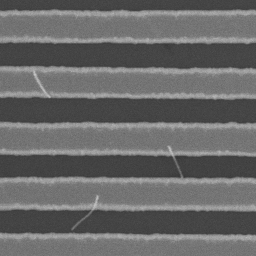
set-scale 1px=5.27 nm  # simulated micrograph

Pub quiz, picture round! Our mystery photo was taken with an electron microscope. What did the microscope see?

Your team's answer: lines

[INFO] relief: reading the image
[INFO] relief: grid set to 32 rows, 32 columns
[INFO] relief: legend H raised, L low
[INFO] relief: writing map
LLLLLLLLLLLLLLLLLLLLLLLLLLLLLLLL
HHHHHHHHHHHHHHHHHHHHHHHHHHHHHHHH
HHHHHHHHHHHHHHHHHHHHHHHHHHHHHHHH
HHHHHHHHHHHHHHHHHHHHHHHHHHHHHHHH
HHHHHHHHHHHHHHHHHHHHHHHHHHHHHHHH
LLLLLLLLLLLLLLLLLLLLLLLLLLLLLLLL
LLLLLLLLLLLLLLLLLLLLLLLLLLLLLLLL
LLLLLLLLLLLLLLLLLLLLLLLLLLLLLLLL
HHHHHHHHHLHHHHLHLLLLLLLLLLLLLLLL
HHHHHHHHHHHHHHHHHHHHHHHHHHHHHHHH
HHHHHHHHHHHHHHHHHHHHHHHHHHHHHHHH
HHHHHHHHHHHHHHHHHHHHHHHHHHHHHHHH
LLLLLLLLLLLLLLLLLLLLLLLLLLLLLLLL
LLLLLLLLLLLLLLLLLLLLLLLLLLLLLLLL
LLLLLLLLLLLLLLLLLLLLLLLLLLLLLLLL
HHHHLLHHHHHHHHHHHHHHHHHHHLLHHHLH
HHHHHHHHHHHHHHHHHHHHHHHHHHHHHHHH
HHHHHHHHHHHHHHHHHHHHHHHHHHHHHHHH
HHHHHHHHHHHHHHHHHHHHHHHHHHHHHHHH
LLLLLLLLLLLLLLLLLLLLLHLLLLLLLLHH
LLLLLLLLLLLLLLLLLLLLLLLLLLLLLLLL
LLLLLLLLLLLLLLLLLLLLLLLLLLLLLLLL
HHHHHHHHHHHHHHHHHHHHHHHHHHHHHHHH
HHHHHHHHHHHHHHHHHHHHHHHHHHHHHHHH
HHHHHHHHHHHHHHHHHHHHHHHHHHHHHHHH
HHHHHHHHHHHHHHHHHHHHHHHHHHHHHHHH
LLLLLLLLLLLLLLLLLLLLLLLLLLLLLLLL
LLLLLLLLLLLLLLLLLLLLLLLLLLLLLLLL
LLLLLLLLLLLLLLLLLLLLLLLLLLLLLLLL
HHHHHHHHHHHHHHHHHHHHHHHHHHHHHHHH
HHHHHHHHHHHHHHHHHHHHHHHHHHHHHHHH
HHHHHHHHHHHHHHHHHHHHHHHHHHHHHHHH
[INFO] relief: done